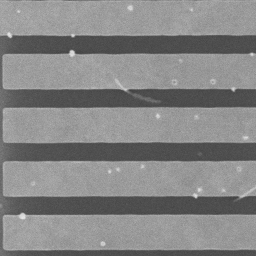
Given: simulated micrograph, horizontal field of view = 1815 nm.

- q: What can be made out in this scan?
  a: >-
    groups of lines, slits or small figures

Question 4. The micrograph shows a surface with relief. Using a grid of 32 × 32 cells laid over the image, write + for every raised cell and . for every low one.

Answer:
++++++++++++++++++++++++++++++++
++++++++++++++++++++++++++++++++
++++++++++++++++++++++++++++++++
++++++++++++++++++++++++++++++++
................................
................................
................................
++++++++++++++++++++++++++++++++
++++++++++++++++++++++++++++++++
++++++++++++++++++++++++++++++++
++++++++++++++++++++++++++++++++
................................
................................
..+++++.+..+++++++++++++++++++++
++++++++++++++++++++++++++++++++
++++++++++++++++++++++++++++++++
++++++++++++++++++++++++++++++++
++++++++++++++++++++++++++++++++
................................
................................
.+++++++++++++++++++++++++++++++
++++++++++++++++++++++++++++++++
++++++++++++++++++++++++++++++++
++++++++++++++++++++++++++++++++
........................+....++.
................................
................................
++++++++++++++++++++++++++++++++
++++++++++++++++++++++++++++++++
++++++++++++++++++++++++++++++++
++++++++++++++++++++++++++++++++
................................